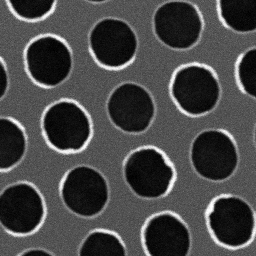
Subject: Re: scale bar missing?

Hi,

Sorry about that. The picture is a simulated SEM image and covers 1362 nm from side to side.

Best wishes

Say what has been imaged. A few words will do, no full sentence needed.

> a regular array of holes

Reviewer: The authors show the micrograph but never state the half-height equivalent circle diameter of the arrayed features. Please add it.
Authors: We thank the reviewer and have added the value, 47.2 px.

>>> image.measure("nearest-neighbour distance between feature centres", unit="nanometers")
356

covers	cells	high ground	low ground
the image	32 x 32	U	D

UDDDDDDUUUUUUUUUUUUUUDDDUUUUDDDD
UUDDDDUUUUUUUUUUUUUUDDDDDUUUDDDD
UUUUUUUUUUUUUDDUUUUDDDDDDUUUDDDD
UUUUUUUUUUUUDDDDUUUDDDDDDUUUUDDD
UUUUUUUUUUUDDDDDDUUUDDDDDUUUUUUU
UUUUDDDDUUUDDDDDDUUUUDDDUUUUUUUU
UUUDDDDDDUUUDDDDDUUUUUUUUUUUUUUD
UUUDDDDDDUUUDDDDUUUUUUUUUUUUUUDD
UUUUDDDDDUUUUUUUUUUUUUUDDUUUUUDD
DUUUDDDDUUUUUUUUUUUUUUDDDDDUUUDD
DUUUUDDUUUUUUUUUDUUUUUDDDDDUUUDD
DUUUUUUUUUUUUUDDDDUUUUDDDDDUUUUD
UUUUUUUUUUUUUUDDDDDUUUDDDDDUUUUU
UUUUUUDDDDUUUDDDDDDUUUUDDDDUUUUU
UUUUUUDDDDDUUUDDDDDUUUUUUUUUUUUU
DDUUUDDDDDDUUUDDDDDUUUUUUUUUUUUU
DDDUUUDDDDDUUUUUDUUUUUUUUDDDUUUU
DDDUUUDDDDDUUUUUUUUUUUUUDDDDDUUU
DDDUUUUDDDUUUUUUUUUUUUUUDDDDDUUU
DDDUUUUUUUUUUUUUDDDDUUUUDDDDDDUU
DDUUUUUUUUUUUUUUDDDDDUUUDDDDDDUU
UUUUUUUUUDDDUUUUDDDDDDUUUDDDDUUU
UUUUUUUUDDDDDUUUDDDDDUUUUUUDUUUU
UDDDUUUUDDDDDUUUDDDDDUUUUUUUUUUU
DDDDDUUUDDDDDUUUUUDDUUUUUUUUUUUU
DDDDDUUUDDDDDUUUUUUUUUUUUUUDDDDU
DDDDDUUUUDDDUUUUUUUUUUUUUUDDDDDU
DDDDDUUUUUUUUUUUUUUDDDUUUUDDDDDD
UDDDUUUUUUUUUUUUUUDDDDDUUUDDDDDD
UUUUUUUUUUUDDDUUUUDDDDDDUUUDDDDU
UUUUUUUUUUDDDDDUUUDDDDDDUUUUDDUU
UUUDDDUUUUDDDDDDUUUDDDDDUUUUUUUU